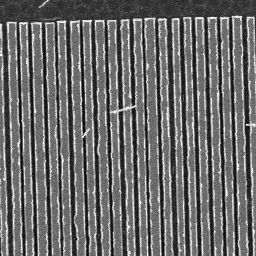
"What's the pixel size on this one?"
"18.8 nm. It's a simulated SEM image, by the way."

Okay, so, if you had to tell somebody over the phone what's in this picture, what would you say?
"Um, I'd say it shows parallel lines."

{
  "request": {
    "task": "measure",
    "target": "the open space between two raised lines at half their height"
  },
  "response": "86.9 nanometres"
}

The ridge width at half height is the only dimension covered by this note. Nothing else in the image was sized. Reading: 157 nm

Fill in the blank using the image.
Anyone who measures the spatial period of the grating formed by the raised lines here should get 235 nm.